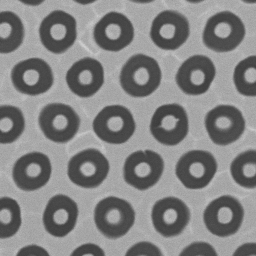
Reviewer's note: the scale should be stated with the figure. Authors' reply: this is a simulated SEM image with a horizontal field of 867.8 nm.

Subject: a regular array of ring-shaped grooves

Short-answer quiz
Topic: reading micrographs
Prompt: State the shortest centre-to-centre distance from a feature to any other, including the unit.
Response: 175 nm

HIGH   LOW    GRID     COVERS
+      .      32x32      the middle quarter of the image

++........+++++.........+++++...
+.........++++....+++...+++++...
+...+++...++++....+++...++++....
....+++...++++...++++...++++....
+...+++...++++....+++...++++....
+........+++++..........+++++...
++.......++++++........+++++++..
+++....+++++++++......+++++++++.
++++++++++++++++++++++++++++++++
++++++++++++++++++++++++++++++++
.++++++++++...++++++++++.....+++
..+++++++.......+++++++.......++
...++++++........+++++........++
+...++++....++...+++++...+++...+
+...+++....++++...++++..++++...+
+...+++....++++...++++..++++...+
...++++.....++....++++...++....+
...+++++.........+++++.........+
..+++++++.......+++++++.......++
+++++++++++....+++++++++.....+++
++++++++++++++++++++++++++++++++
++++++..++++++++++++++++++++++++
+++......++++++++......+++++++..
++........++++++........+++++...
+....++....++++..........++++...
+...++++...++++...+++....+++....
+...++++...++++...++++...+++...+
+...++++...++++...+++...++++....
+.........+++++.........++++....
++.......+++++++.......++++++...
++++....+++++++++.....++++++++..
++++++++++++++++++++++++++++++++